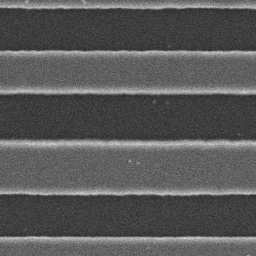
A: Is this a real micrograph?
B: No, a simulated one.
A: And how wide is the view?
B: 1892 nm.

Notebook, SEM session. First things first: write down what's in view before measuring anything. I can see lines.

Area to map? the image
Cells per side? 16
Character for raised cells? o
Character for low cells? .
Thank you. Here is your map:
........oo......
................
................
oooooooooooooooo
oooooooooooooooo
oooooooooooooooo
................
................
................
oooooooooooooooo
oooooooooooooooo
oooooooooooooooo
................
................
................
oooooooooooooooo